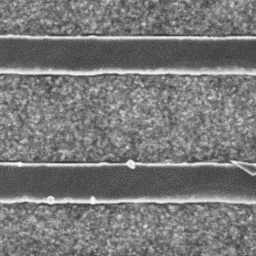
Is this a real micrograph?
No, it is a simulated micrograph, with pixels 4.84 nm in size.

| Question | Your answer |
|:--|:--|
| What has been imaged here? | lines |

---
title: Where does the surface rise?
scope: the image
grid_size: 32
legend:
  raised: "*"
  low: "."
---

................................
................................
................................
................................
.*..............................
********************************
********************************
********************************
********************************
................................
................................
................................
................................
................................
................................
................................
................................
................................
................................
................................
***.........**.***.....****.***.
********************************
********************************
********************************
********************************
................................
................................
................................
................................
................................
................................
................................